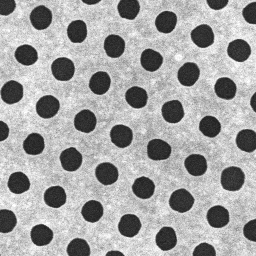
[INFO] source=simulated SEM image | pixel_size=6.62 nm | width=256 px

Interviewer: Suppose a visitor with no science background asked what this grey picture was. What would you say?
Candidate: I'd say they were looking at a regular array of holes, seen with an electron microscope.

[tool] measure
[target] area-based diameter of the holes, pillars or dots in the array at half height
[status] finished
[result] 0.151 micrometres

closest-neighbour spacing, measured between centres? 0.26 microns